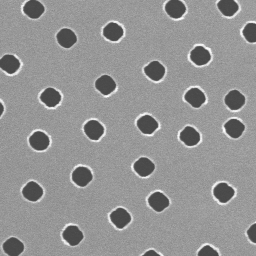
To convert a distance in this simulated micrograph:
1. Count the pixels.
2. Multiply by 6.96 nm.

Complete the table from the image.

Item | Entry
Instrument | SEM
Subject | a regular array of holes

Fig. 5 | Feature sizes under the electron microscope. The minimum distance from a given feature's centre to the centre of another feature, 0.314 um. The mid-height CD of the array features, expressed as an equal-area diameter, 135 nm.